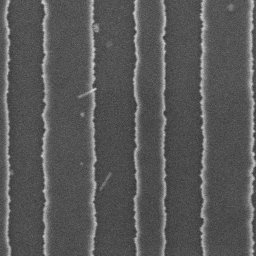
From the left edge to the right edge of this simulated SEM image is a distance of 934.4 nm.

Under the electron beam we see lines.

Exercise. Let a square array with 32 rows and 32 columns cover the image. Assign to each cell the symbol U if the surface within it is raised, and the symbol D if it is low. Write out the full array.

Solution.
UDDDDUUUUUUUDDDDDUUUDDDDDUUUUUUU
UDDDDDUUUUUUDDDDDUUUUDDDDUUUUUUU
UDDDDUUUUUUUDDDDDUUUUDDDDUUUUUUU
UDDDDUUUUUUUDDDDDUUUUDDDDUUUUUUU
UDDDDUUUUUUUDDDDDUUUDDDDDUUUUUUD
UDDDDUUUUUUUDDDDDUUUUDDDDUUUUUUD
UDDDDDUUUUUUDDDDDUUUUDDDDUUUUUUD
UDDDDUUUUUUUDDDDDUUUUDDDDUUUUUUU
UDDDDUUUUUUUDDDDDUUUUDDDDUUUUUUU
UDDDDUUUUUUUDDDDDUUUUDDDDUUUUUUU
UDDDDUUUUUUUDDDDDUUUUDDDDUUUUUUD
UDDDDDUUUUUUDDDDDUUUDDDDDUUUUUUU
UDDDDDUUUUUUDDDDDUUUUDDDDUUUUUUU
UDDDDDUUUUUUDDDDDUUUUDDDDUUUUUUU
UDDDDUUUUUUUDDDDDUUUUDDDDUUUUUUU
UDDDDDUUUUUUDDDDDUUUUDDDDUUUUUUU
UDDDDDUUUUUUDDDDDUUUUDDDDUUUUUUU
UDDDDUUUUUUUDDDDDUUUUDDDDUUUUUUU
UDDDDUUUUUUUDDDDDUUUDDDDDUUUUUUU
UDDDDUUUUUUUDDDDDUUUUDDDDUUUUUUU
UDDDDUUUUUUUDDDDDUUUUDDDDUUUUUUU
UDDDDUUUUUUUDDDDDUUUUDDDDUUUUUUU
UDDDDDUUUUUUDDDDDUUUUDDDDUUUUUUU
UDDDDDUUUUUUDDDDDUUUUDDDDUUUUUUU
UDDDDDUUUUUUDDDDDUUUUDDDDUUUUUUD
UDDDDDUUUUUUDDDDDUUUUDDDDUUUUUUD
UDDDDUUUUUUUDDDDDUUUUDDDDUUUUUUU
UDDDDUUUUUUUDDDDDUUUUDDDDUUUUUUU
UDDDDDUUUUUUDDDDDUUUUDDDDUUUUUUD
UDDDDUUUUUUUDDDDDUUUUDDDDUUUUUUD
UDDDDUUUUUUUDDDDDUUUUDDDDUUUUUUU
UDDDDUUUUUUUDDDDDUUUDDDDDUUUUUUU